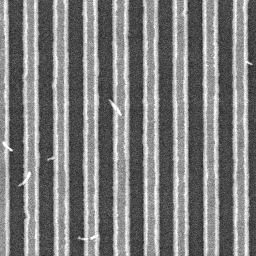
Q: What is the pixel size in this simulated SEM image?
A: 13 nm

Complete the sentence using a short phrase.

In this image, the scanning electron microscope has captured parallel lines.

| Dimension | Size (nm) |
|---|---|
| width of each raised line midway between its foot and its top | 161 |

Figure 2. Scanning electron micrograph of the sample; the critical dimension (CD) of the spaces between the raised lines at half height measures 0.234 microns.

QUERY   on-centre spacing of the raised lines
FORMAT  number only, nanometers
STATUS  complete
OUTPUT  389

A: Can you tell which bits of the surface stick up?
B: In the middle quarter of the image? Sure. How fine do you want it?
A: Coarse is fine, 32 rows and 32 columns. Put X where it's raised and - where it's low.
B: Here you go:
X----XXX-----XXX----XXX-----XX--
X----XXX-----XXX----XXX-----XX--
X----XXX-----XXX----XXX-----XX--
X----XXX-----XXX----XXX-----XX--
X----XXX-----XXX----XXX-----XX--
X----XXX-----XXX----XXX-----XX--
X----XXX-----XXX----XXX-----XX--
X----XXX-----XXX----XXX-----XX--
X----XXX-----XXX----XXX-----XXX-
X----XXX----XXXX----XXX-----XXX-
X----XXX----XXXX----XXX-----XXX-
X----XXX-----XXX----XXX-----XXX-
X----XXX-----XXX----XXX-----XXX-
X----XXX-----XXX----XXX-----XXX-
X----XXX-----XXX----XXX-----XXX-
X----XXX-----XXX----XXX-----XXX-
X----XXX-----XXX----XXX-----XXX-
-----XXX-----XXX----XXX-----XXX-
X----XXX-----XXX----XXX-----XXX-
X----XXX-----XXX----XXX-----XXX-
X----XXX-----XXX----XXX-----XXX-
X----XXX-----XXX----XXX-----XXX-
X----XXX-----XXX----XXX-----XXX-
X----XXX-----XXX----XXX-----XXX-
X----XXX-----XXX----XXX-----XXX-
X----XXX-----XXX----XXX-----XXX-
X----XXX-----XXX----XXX-----XXX-
X----XXX-----XXX----XXX-----XXX-
X----XXX-----XXX----XXX-----XXX-
X----XXX-----XXX----XXX-----XXX-
X----XXX-----XXX----XXX-----XXX-
X----XXX-----XXX----XXX-----XXX-